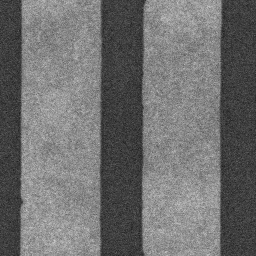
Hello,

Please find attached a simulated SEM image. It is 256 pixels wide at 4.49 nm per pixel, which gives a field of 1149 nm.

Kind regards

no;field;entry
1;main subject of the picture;one or a few lines or trenches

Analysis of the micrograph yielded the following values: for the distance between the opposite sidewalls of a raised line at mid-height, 355 nm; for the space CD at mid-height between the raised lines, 41.6 pixels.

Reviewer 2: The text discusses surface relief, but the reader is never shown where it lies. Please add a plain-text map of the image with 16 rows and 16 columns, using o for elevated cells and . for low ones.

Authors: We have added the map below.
.ooooo...ooooo..
.ooooo...ooooo..
.ooooo...ooooo..
.ooooo...ooooo..
.ooooo...ooooo..
.ooooo...ooooo..
.ooooo...ooooo..
.ooooo...ooooo..
.ooooo...ooooo..
.ooooo...ooooo..
.ooooo...ooooo..
.ooooo...ooooo..
.ooooo...ooooo..
.ooooo...ooooo..
.ooooo...ooooo..
.ooooo...ooooo..